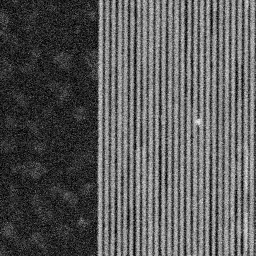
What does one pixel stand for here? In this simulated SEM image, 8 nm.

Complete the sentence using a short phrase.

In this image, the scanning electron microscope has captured parallel lines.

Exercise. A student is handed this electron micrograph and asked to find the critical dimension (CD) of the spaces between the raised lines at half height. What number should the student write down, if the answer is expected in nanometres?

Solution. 28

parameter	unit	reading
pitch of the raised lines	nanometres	50.5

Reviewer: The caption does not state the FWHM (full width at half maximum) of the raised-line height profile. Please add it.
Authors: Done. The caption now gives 21 nm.